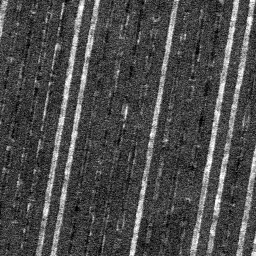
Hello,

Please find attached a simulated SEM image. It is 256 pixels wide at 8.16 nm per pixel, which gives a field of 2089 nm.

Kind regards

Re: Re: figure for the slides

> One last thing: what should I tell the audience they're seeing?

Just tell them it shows parallel lines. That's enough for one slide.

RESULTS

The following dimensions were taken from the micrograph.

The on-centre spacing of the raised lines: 124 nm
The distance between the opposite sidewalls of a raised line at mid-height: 31.2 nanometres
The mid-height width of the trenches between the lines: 0.0935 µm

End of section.